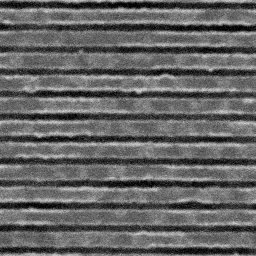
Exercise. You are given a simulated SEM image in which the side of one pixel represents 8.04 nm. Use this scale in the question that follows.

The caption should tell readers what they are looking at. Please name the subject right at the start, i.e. parallel lines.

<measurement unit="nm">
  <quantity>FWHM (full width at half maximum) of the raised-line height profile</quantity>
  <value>117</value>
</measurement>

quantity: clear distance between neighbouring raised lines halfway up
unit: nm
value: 64.3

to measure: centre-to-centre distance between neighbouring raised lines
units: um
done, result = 0.179